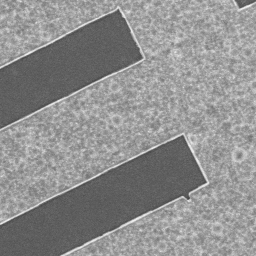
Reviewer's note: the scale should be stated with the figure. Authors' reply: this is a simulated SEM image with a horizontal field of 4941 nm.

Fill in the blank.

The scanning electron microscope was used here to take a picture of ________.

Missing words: one or a few lines or trenches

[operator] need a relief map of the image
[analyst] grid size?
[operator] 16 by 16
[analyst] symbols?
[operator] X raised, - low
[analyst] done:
XXXXXXXXXXXXXXXX
XXXXX---XXXXXXXX
XXX------XXXXXXX
X--------XXXXXXX
-------XXXXXXXXX
-----XXXXXXXXXXX
---XXXXXXXXXXXXX
-XXXXXXXXXXXXXXX
XXXXXXXXXXXXXXXX
XXXXXXXXX---XXXX
XXXXXXX------XXX
XXXXX--------XXX
XXX--------XXXXX
X--------XXXXXXX
-------XXXXXXXXX
-----XXXXXXXXXXX